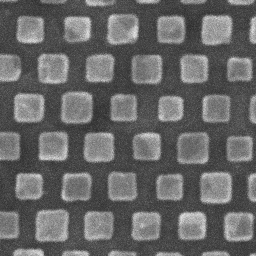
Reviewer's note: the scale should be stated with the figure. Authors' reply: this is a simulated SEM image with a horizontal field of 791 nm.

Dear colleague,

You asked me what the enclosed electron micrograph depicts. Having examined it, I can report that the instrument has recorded a regular array of raised bodies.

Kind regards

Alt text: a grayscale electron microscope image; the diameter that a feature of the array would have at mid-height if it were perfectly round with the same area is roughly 93.3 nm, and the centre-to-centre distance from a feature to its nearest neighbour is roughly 0.139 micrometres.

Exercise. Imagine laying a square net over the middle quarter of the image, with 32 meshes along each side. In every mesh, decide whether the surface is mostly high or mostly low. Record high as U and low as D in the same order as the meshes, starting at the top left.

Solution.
UDDDDDUUUUUUDDDDDUUUUUUUDDDDDUUU
UDDDDDUUUUUUDDDDDUUUUUUUDDDDDDUU
UDDDDDUUUUUUDDDDDUUUUUUUDDDDDUUU
UDDDDDUUUUUUDDDDDUUUUUUUDDDDDUUU
DDDDDDDDDDDDDDDDDUUUUUUUDDDDDDDD
DDDDDDDDDDDDDDDDDDDDDDDDDDDDDDDD
DDDDDDDDDDDDDDDDDDDDDDDDDDDDDDDD
UUUUUUDDDDDDDDDDDDDDDDDDDDDDDDDD
UUUUUUUDDDDDUUUUUUDDDDDDUUUUUDDD
UUUUUUUDDDDDUUUUUUDDDDDDUUUUUUDD
UUUUUUUDDDDDUUUUUUDDDDDDUUUUUUDD
UUUUUUUDDDDDUUUUUUDDDDDDUUUUUUDD
UUUUUUUDDDDDUUUUUUDDDDDDUUUUUUDD
UUUUUUUDDDDDUUUUUUDDDDDDUUUUUDDD
UUUUUDDDDDDDDDDDDDDDDDDDDDDDDDDD
DDDDDDDDDDDDDDDDDDDDDDDDDDDDDDDD
DDDDDDDDDDDDDDDDDDDDDDDDDDDDDDDD
UDDDDDUUUUUUDDDDDDDDDDDDDDDDDDDU
UDDDDUUUUUUUDDDDDUUUUUUUDDDDDUUU
UDDDDUUUUUUUDDDDDUUUUUUUDDDDDUUU
UDDDDUUUUUUUDDDDDUUUUUUUDDDDDUUU
UDDDDUUUUUUUDDDDDUUUUUUUDDDDDUUU
UDDDDUUUUUUUDDDDDUUUUUUUDDDDDUUU
UDDDDUUUUUUUDDDDDDUUUUUUDDDDDUUU
DDDDDDDDDDDDDDDDDDDDDDDDDDDDDUUU
DDDDDDDDDDDDDDDDDDDDDDDDDDDDDDDD
DDDDDDDDDDDDDDDDDDDDDDDDDDDDDDDD
UUUDDDDDDDDDUUUUUDDDDDDDDDDDDDDD
UUUUUUUDDDDUUUUUUUDDDDDDUUUUUDDD
UUUUUUUDDDDUUUUUUUDDDDDUUUUUUDDD
UUUUUUUDDDDUUUUUUUDDDDDUUUUUUUDD
UUUUUUUDDDDUUUUUUUDDDDDUUUUUUUDD